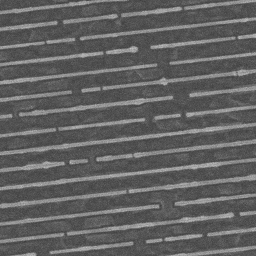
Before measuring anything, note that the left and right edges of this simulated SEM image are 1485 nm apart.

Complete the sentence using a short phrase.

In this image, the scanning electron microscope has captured parallel lines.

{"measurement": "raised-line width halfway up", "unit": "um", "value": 0.0202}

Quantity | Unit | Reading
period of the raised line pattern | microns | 0.102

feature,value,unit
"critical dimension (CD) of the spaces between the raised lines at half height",14.2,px